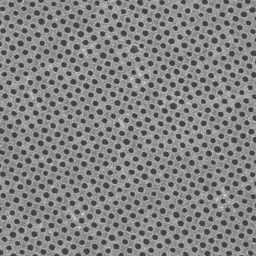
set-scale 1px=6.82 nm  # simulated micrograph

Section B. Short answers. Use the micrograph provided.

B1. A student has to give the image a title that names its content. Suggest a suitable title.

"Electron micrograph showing a regular array of holes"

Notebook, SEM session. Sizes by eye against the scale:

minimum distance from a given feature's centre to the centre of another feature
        0.0641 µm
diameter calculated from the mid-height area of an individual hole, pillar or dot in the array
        40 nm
